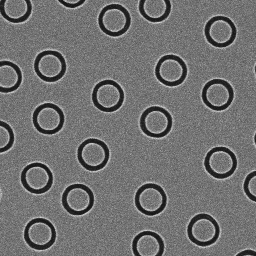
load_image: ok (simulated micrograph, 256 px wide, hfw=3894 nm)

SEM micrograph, a regular array of ring-shaped grooves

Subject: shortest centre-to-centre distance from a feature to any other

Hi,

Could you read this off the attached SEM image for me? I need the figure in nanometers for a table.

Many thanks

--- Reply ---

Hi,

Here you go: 803